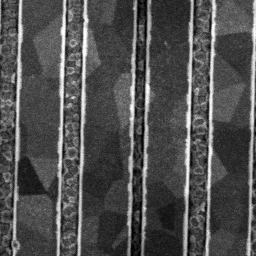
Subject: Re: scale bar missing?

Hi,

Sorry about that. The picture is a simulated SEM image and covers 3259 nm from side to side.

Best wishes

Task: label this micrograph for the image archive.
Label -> one or a few lines or trenches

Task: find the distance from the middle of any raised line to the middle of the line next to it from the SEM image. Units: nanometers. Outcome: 814